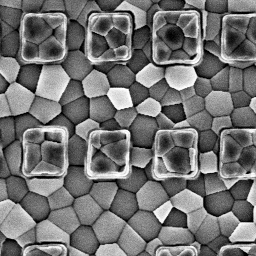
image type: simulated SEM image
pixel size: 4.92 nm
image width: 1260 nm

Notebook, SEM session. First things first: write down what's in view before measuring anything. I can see raised bodies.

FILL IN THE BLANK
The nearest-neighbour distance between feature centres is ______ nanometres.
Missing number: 323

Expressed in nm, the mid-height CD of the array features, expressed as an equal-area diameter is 231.